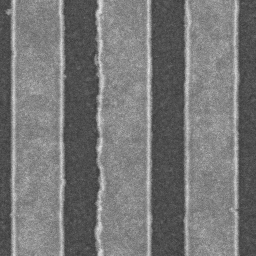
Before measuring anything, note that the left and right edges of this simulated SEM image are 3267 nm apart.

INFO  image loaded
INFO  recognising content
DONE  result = one or a few lines or trenches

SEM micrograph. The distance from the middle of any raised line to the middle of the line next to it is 1110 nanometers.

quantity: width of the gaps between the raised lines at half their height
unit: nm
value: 494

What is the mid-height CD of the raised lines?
616 nanometers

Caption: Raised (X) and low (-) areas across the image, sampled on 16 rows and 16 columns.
-XXX--XXX---XXX-
-XXX--XXX---XXX-
-XXX--XXX---XXX-
-XXX--XXX---XXX-
-XXX--XXX---XXX-
-XXX--XXX---XXX-
-XXX--XXX---XXX-
-XXX--XXX---XXX-
-XXX--XXX---XXX-
-XXX--XXX---XXX-
-XXX--XXX---XXX-
-XXX--XXX---XXX-
-XXX--XXX---XXX-
-XXX--XXX---XXX-
-XXX--XXX---XXX-
-XXX--XXX---XXX-